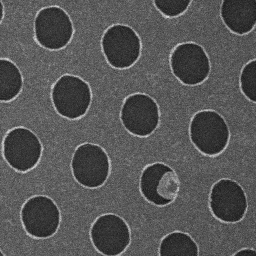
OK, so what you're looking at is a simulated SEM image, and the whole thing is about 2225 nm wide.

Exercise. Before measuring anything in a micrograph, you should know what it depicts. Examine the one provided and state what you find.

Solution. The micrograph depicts a regular array of holes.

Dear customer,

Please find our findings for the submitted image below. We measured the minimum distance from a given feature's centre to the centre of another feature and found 610 nanometres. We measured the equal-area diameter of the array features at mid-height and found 354 nanometres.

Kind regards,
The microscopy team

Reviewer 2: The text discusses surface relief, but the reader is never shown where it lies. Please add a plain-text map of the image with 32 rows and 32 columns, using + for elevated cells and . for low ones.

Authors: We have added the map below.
+++++++++++++++++++.....++++....
+++++...++++++++++++...+++++....
++++.....+++++++++++++++++++....
++++.....+++++..+++++++++++++...
++++.....++++....+++++++++++++++
+++++...+++++.....+++++..+++++++
+++++++++++++....+++++....++++++
.++++++++++++....++++.....++++++
..+++++++++++++++++++.....++++..
...+++++.+++++++++++++....++++..
...++++....++++++++++++..+++++..
..+++++....+++++++++++++++++++..
.++++++....+++++...++++++++++++.
+++++++....++++.....++++++++++++
++++++++..+++++.....++++....++++
+++++++++++++++.....++++....++++
+...++++++++++++...+++++.....+++
+....+++++++++++++++++++.....+++
.....+++++...++++++++++++...++++
+....++++....+++++++++++++++++++
+....++++.....+++++.++++++++++++
+++++++++.....++++....++++++++++
++++++++++...+++++...+++++++.+++
++++++++++++++++++..+++++++...++
++++++++++++++++++...+++++.....+
+++....++++++++++++..+++++.....+
+++....++++++++++++++++++++....+
+++....+++++...+++++++++++++..++
+++....++++.....++++++++++++++++
++++..+++++.....+++++...++++++++
++++++++++++....++++....++++++++
++++++++++++...+++++.....+++++..